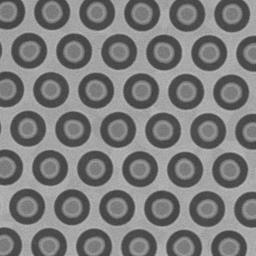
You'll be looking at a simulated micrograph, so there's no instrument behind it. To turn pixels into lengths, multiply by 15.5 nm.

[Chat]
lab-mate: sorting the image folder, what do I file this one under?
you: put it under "an array of small figures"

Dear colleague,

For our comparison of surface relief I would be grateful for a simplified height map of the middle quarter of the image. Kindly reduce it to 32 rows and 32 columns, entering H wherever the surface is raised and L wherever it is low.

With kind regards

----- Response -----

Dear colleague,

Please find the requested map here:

LLLLLLHHHHHLLLLLLHHHHHLLLLLLHHHH
HHLLHHHHHHHHLLLHHHHHHHHLLLLHHHHH
HHHHHHLLLLHHHHHHHLLLLHHHHHHHHLLL
HHHHHLLLLLLHHHHHLLLLLLLHHHHLLLLL
LHHHLLLHHLLLHHHLLLLLLLLHHHLLLLLL
LHHLLLHHHHLLLHHLLLHHHLLLHHLLLHHH
LLHLLLHHHHLLLHHLLHHHHLLLHHLLLHHH
LHHLLLHHHHLLLHLLLHHHHLLLHHLLLHHH
LHHHLLLHHLLLHHHLLLHHHLLLHHLLLHHH
HHHHLLLLLLLLHHHLLLLLLLLHHHLLLLLL
HHHHHLLLLLLHHHHHLLLLLLHHHHHHLLLL
HHHHHHHLHHHHHHHHHHHLHHHHHHHHHLLL
LLLLLHHHHHHLLLLLHHHHHHLLLLLHHHHH
LLLLLLHHHHLLLLLLLHHHHLLLLLLLHHHH
LLHLLLLHHLLLLHHLLLHHHLLLLLLLLHHH
HHHHLLLHHLLLHHHLLLHHLLLHHHLLLHHL
HHHHLLLHHLLLHHHLLLHHLLLHHHHLLLHL
LHHHLLLHHLLLHHHLLLHHLLLHHHHLLHHL
LLLLLLLHHLLLLHHLLLHHLLLLHHLLLHHH
LLLLLLHHHHLLLLLLLHHHHLLLLLLLLHHH
LLLLLHHHHHHLLLLLHHHHHHLLLLLHHHHH
HHHHHHHLLHHHHHHHHHHHHHHHHHHHHHHH
HHHHHLLLLLLHHHHHLLLLLLHHHHHHLLLL
LHHHLLLLLLLLHHHLLLLLLLLHHHHLLLLL
LHHLLLLHHLLLHHHLLLHHLLLHHHLLLHHL
LHHLLLHHHHLLLHLLLHHHHLLLHHLLHHHH
LHHLLLHHHHLLHHLLLHHHHLLLHHLLHHHH
LHHLLLHHHLLLHHLLLHHHHLLLHHLLLHHH
LHHHLLLLLLLLHHHLLLLLLLLHHHLLLLLL
HHHHLLLLLLLHHHHHLLLLLLHHHHHLLLLL
HHHHHHLLLLHHHHHHHLLLLHHHHHHHLLLL
LLLLHHHHHHHHLLHHHHHHHHHHLLHHHHHH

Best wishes